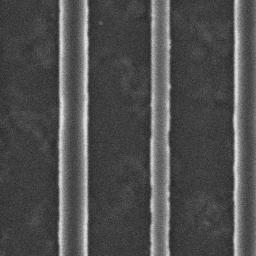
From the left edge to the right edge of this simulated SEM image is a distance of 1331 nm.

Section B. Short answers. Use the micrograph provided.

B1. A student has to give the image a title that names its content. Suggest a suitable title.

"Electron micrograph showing lines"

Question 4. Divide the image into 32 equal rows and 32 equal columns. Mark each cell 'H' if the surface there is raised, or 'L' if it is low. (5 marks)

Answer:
LLLLLLLLHHHLLLLLLLLHHLLLLLLLLLHH
LLLLLLLLHHHLLLLLLLLHHLLLLLLLLHHH
LLLLLLLLHHHLLLLLLLLHHLLLLLLLLHHH
LLLLLLLLHHHLLLLLLLLHHLLLLLLLLHHH
LLLLLLLLHHHLLLLLLLLHHLLLLLLLLLHH
LLLLLLLLHHHLLLLLLLLHHLLLLLLLLLHH
LLLLLLLLHHHLLLLLLLLHHLLLLLLLLLHH
LLLLLLLLHHHLLLLLLLLHHLLLLLLLLLHH
LLLLLLLLHHHLLLLLLLLHHLLLLLLLLLHH
LLLLLLLLHHHLLLLLLLLHHLLLLLLLLLHH
LLLLLLLLHHHLLLLLLLLHHLLLLLLLLLHH
LLLLLLLLHHHLLLLLLLLHHLLLLLLLLLHH
LLLLLLLLHHHLLLLLLLLHHLLLLLLLLLHH
LLLLLLLLHHHLLLLLLLLHHLLLLLLLLHHH
LLLLLLLLHHHLLLLLLLLHHLLLLLLLLHHH
LLLLLLLLHHHLLLLLLLLHHLLLLLLLLHHH
LLLLLLLLHHHLLLLLLLLHHLLLLLLLLHHH
LLLLLLLLHHHLLLLLLLLHHLLLLLLLLLHH
LLLLLLLLHHHLLLLLLLLHHLLLLLLLLLHH
LLLLLLLLHHHLLLLLLLLHHLLLLLLLLLHH
LLLLLLLLHHHLLLLLLLLHHLLLLLLLLHHH
LLLLLLLLHHHLLLLLLLLHHLLLLLLLLHHH
LLLLLLLLHHHLLLLLLLLHHLLLLLLLLLHH
LLLLLLLLHHHLLLLLLLLHHLLLLLLLLHHH
LLLLLLLLHHHLLLLLLLLHHLLLLLLLLHHH
LLLLLLLLHHHLLLLLLLLHHLLLLLLLLHHH
LLLLLLLLHHHLLLLLLLLHHLLLLLLLLHHH
LLLLLLLLHHHLLLLLLLLHHLLLLLLLLHHH
LLLLLLLLHHHLLLLLLLLHHLLLLLLLLHHH
LLLLLLLLHHHLLLLLLLLHHLLLLLLLLHHH
LLLLLLLLHHHLLLLLLLLHHLLLLLLLLHHH
LLLLLLLLHHHLLLLLLLLHHLLLLLLLLHHH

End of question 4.